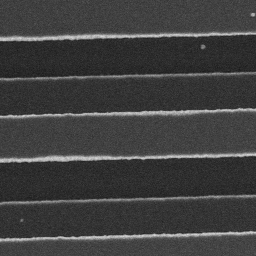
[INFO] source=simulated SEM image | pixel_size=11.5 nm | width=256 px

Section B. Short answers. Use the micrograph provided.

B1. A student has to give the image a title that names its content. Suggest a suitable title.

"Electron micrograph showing lines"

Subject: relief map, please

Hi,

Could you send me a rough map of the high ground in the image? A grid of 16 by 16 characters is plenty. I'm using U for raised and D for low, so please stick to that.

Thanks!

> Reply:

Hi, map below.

UUUUUUUUUUUUUUUU
UUUUUUUUUUUUUUUU
UUDDDDDDDDDDDDDD
DDDDDDDDDDDDDDDD
DDDDDDDDDDDDDDDD
DDDDDDDDDDDDDDDD
DDDDDDDDDDDDDDDD
UUUUUUUUUUUUUUUU
UUUUUUUUUUUUUUUU
UUUUUUUUUUUUUUUU
DDDDDDDDDDDDDDDD
DDDDDDDDDDDDDDDD
DDDDDDDDDDDDDDDD
DDDDDDDDDDDDDDDD
DDDDDDDDDDDDDDDD
UUUUUUUUUUUUUUUU